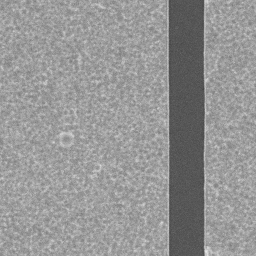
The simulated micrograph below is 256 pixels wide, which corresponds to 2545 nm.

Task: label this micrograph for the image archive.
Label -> one or a few lines or trenches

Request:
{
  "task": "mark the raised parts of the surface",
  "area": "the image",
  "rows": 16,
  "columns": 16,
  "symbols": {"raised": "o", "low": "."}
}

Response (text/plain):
oooooooooo...ooo
ooooooooooo..ooo
oooooooooo...ooo
oooooooooo...ooo
oooooooooo...ooo
ooooooooooo..ooo
ooooooooooo..ooo
ooooooooooo..ooo
ooooooooooo..ooo
ooooooooooo..ooo
ooooooooooo..ooo
ooooooooooo..ooo
ooooooooooo..ooo
ooooooooooo..ooo
oooooooooo...ooo
ooooooooooo..ooo